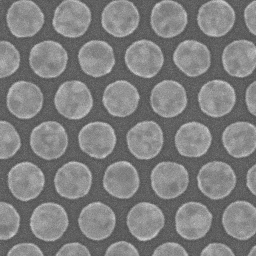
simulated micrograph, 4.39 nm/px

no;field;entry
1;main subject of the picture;a regular array of raised bodies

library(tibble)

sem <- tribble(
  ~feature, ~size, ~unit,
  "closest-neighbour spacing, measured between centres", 205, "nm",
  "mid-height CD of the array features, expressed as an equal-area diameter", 0.161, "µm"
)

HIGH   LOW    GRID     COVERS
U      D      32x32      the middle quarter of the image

DDDDUUUUUUUUDDDDUUUUUUUUDDDDUUUU
DDDDDUUUUUUUDDDDDUUUUUUUDDDDDUUU
DDDDDDUUUUUDDDDDDDUUUUUDDDDDDDDU
DDDDDDDDDDDDDDDDDDDDDDDDDDDDDDDD
UUUUDDDDDDDDDUUUDDDDDDDDDUUUDDDD
UUUUUDDDDDDUUUUUUDDDDDDUUUUUUDDD
UUUUUUDDDDDUUUUUUUDDDDUUUUUUUUDD
UUUUUUUDDDUUUUUUUUUDDDUUUUUUUUDD
UUUUUUUDDDUUUUUUUUUDDDUUUUUUUUDD
UUUUUUUDDDUUUUUUUUUDDDUUUUUUUUUD
UUUUUUUDDDUUUUUUUUDDDDUUUUUUUUDD
UUUUUUDDDDDUUUUUUUDDDDDUUUUUUUDD
UUUUUUDDDDDDUUUUDDDDDDDDUUUUUDDD
DUUUDDDDDDDDDDDDDDDDDDDDDDDDDDDD
DDDDDDDDDDDDDDDDDDDDDUDDDDDDDDDD
DDDDDDUUUUUDDDDDDDUUUUUUDDDDDUUU
DDDDUUUUUUUUDDDDUUUUUUUUDDDDDUUU
DDDDUUUUUUUUDDDDUUUUUUUUUDDDUUUU
UDDDUUUUUUUUUDDDUUUUUUUUUDDDUUUU
UDDDUUUUUUUUUDDDUUUUUUUUUDDDUUUU
UDDDUUUUUUUUDDDDUUUUUUUUUDDDUUUU
DDDDDUUUUUUUDDDDDUUUUUUUDDDDDUUU
DDDDDDUUUUUDDDDDDUUUUUUDDDDDDUUU
DDDDDDDDUUDDDDDDDDDDUDDDDDDDDDDD
DDDDDDDDDDDDDUUUDDDDDDDDDDDDDDDD
UUUUUDDDDDDDUUUUUDDDDDDUUUUUUDDD
UUUUUUDDDDDUUUUUUUDDDDUUUUUUUUDD
UUUUUUUDDDUUUUUUUUDDDDUUUUUUUUUD
UUUUUUUDDDUUUUUUUUUDDDUUUUUUUUUD
UUUUUUUDDDUUUUUUUUUDDDUUUUUUUUUD
UUUUUUUDDDUUUUUUUUUDDDUUUUUUUUUD
UUUUUUDDDDDUUUUUUUDDDDDUUUUUUUDD